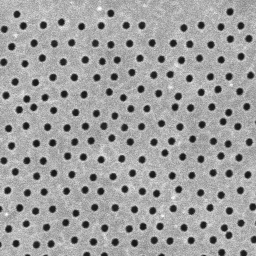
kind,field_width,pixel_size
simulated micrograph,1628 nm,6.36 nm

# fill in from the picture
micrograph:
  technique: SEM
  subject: a regular array of holes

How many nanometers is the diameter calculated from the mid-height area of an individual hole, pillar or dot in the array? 48.2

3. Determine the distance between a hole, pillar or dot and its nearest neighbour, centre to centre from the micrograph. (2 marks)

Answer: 0.105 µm